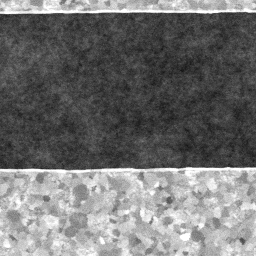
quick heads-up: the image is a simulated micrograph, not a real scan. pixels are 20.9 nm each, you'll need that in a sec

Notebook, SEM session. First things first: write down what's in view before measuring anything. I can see one or a few lines or trenches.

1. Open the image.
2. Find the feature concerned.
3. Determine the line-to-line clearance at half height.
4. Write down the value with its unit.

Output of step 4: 3300 nanometres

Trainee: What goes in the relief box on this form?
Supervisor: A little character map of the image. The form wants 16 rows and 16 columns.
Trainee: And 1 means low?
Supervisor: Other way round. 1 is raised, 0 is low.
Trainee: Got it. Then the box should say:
1111111111111111
0000000000000000
0000000000000000
0000000000000000
0000000000000000
0000000000000000
0000000000000000
0000000000000000
0000000000000000
0000000000000000
0000000000000000
1111111111111111
1111111111111111
1111111111111111
1111111111111111
1111111111111111